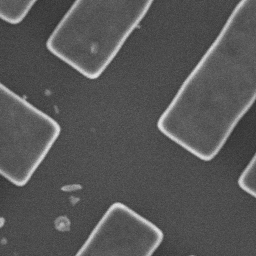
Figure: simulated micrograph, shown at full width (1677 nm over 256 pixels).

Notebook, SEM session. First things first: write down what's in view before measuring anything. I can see groups of lines, slits or small figures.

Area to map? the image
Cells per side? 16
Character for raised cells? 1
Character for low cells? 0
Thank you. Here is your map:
1100111110000001
0000111110000011
0001111100000011
0000111000000111
0000010000001111
0000000000011111
1100000000011111
1110000000111110
1110000000011100
1110000000001100
1100000000000001
0000000000000001
0000000000000000
0000000110000000
0000001111000000
0000011111000000